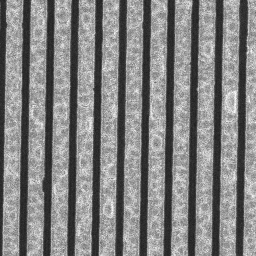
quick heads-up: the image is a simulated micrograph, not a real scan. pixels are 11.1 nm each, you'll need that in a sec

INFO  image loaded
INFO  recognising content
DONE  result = parallel lines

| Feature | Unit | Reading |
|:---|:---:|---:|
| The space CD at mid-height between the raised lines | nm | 74.8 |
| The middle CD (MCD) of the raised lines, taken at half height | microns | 0.193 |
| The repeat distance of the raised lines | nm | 267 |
